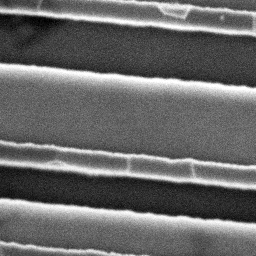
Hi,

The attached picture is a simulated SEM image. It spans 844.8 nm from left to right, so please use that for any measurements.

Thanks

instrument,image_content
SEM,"lines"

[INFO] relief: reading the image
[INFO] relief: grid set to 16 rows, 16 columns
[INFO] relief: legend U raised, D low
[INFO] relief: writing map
UUUUUUUUUUUUUUUU
DDDDDDDDDUUUUUUU
DDDDDDDDDDDDDDDD
DDDDDDDDDDDDDDDD
UUUUUDDDDDDDDDDD
UUUUUUUUUUUUUUUD
UUUUUUUUUUUUUUUU
UUUUUUUUUUUUUUUU
UUUUUUUUUUUUUUUU
UUUUUUUUUUUUUUUU
DDDDUUUUUUUUUUUU
DDDDDDDDDDDDDDUU
UDDDDDDDDDDDDDDD
UUUUUUUUUUDDDDDD
UUUUUUUUUUUUUUUU
UUUUUUUUUUUUUUUU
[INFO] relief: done